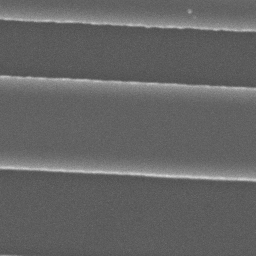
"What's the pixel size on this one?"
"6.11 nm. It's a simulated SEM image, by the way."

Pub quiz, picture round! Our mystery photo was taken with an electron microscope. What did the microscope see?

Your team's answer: lines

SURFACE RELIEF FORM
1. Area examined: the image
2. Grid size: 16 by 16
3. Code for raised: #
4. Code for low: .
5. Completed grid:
################
.......#########
................
................
................
################
################
################
################
################
.###############
................
................
................
................
................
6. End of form